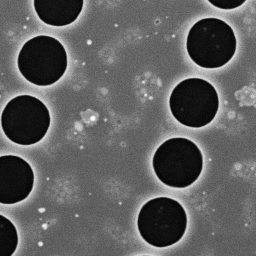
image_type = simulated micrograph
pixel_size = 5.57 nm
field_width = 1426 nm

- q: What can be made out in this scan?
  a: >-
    holes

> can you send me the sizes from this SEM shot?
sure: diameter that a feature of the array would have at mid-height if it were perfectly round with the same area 276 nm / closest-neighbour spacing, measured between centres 0.344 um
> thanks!